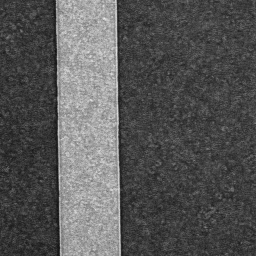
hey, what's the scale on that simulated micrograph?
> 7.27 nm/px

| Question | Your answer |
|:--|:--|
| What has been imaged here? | one or a few lines or trenches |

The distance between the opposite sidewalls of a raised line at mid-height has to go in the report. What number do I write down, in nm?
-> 431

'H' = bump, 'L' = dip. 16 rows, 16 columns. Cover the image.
LLLLHHHLLLLLLLLL
LLLLHHHLLLLLLLLL
LLLLHHHLLLLLLLLL
LLLLHHHLLLLLLLLL
LLLLHHHLLLLLLLLL
LLLLHHHLLLLLLLLL
LLLLHHHLLLLLLLLL
LLLLHHHLLLLLLLLL
LLLLHHHLLLLLLLLL
LLLLHHHLLLLLLLLL
LLLLHHHLLLLLLLLL
LLLLHHHLLLLLLLLL
LLLLHHHLLLLLLLLL
LLLLHHHLLLLLLLLL
LLLLHHHLLLLLLLLL
LLLLHHHLLLLLLLLL